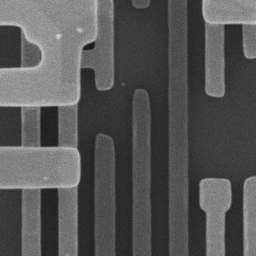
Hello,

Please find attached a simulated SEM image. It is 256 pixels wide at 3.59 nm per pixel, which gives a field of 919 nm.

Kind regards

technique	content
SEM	wiring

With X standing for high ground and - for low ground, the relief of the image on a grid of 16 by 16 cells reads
XXXXXX-------XXX
XXXXXX----------
--XXXX----------
---XX-----------
XXXXX-----------
XXXXX-----------
XXXXX-----------
----------------
----------------
XXXXX-----------
XXXXX-----------
XXXXX-----------
----------------
----------------
----------------
----------------